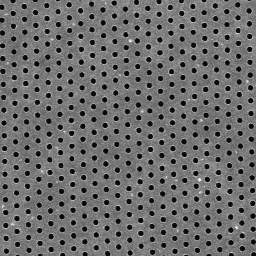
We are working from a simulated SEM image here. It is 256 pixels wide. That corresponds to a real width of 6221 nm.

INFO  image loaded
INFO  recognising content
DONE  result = a regular array of holes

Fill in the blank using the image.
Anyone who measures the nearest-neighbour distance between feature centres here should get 307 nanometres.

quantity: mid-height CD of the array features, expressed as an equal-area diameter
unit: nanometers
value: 132